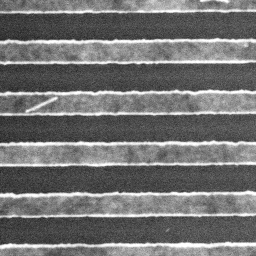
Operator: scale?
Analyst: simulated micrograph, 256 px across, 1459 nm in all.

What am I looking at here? lines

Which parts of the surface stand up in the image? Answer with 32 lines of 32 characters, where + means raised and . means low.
++++++++++++++++++++++++++++++++
+++++++++++++.++................
................................
................................
................................
++++++++++++++++++++++++++++++++
++++++++++++++++++++++++++++++++
++++++++++++++++++++++++++++++++
................................
................................
................................
................+..+.+++.+++++++
++++++++++++++++++++++++++++++++
++++++++++++++++++++++++++++++++
................................
................................
................................
................................
++++++++++++++++++++++++++++++++
++++++++++++++++++++++++++++++++
++++++++++++++++++++++++++++....
................................
................................
................................
++++++++++++++++++++++++++++++++
++++++++++++++++++++++++++++++++
++++++++++++++++++++++++++++++++
................................
................................
................................
............................++++
++++++++++++++++++++++++++++++++